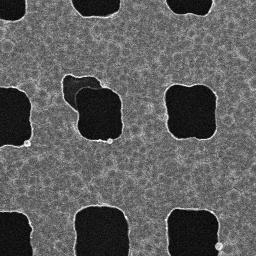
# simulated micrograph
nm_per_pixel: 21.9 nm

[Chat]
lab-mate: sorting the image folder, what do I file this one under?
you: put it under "holes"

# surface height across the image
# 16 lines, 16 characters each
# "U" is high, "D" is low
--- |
DDUUUDDUUUUDDUUU
UUUUUUUUUUUUUUUU
UUUUUUUUUUUUUUUU
UUUUUUUUUUUUUUUU
UUUUUUUUUUUUUUUU
DUUUDDDUUUUDDUUU
DDUUDDDDUUDDDUUU
DDUUUDDDUUDDDUUU
DDUUUDDUUUUDDUUU
UUUUUUUUUUUUUUUU
UUUUUUUUUUUUUUUU
UUUUUUUUUUUUUUUU
UUUUUUUUUUUUUUUU
DUUUUDDDUUUDDUUU
DDUUUDDDUUDDDDUU
DDUUUDDDUUUDDDUU